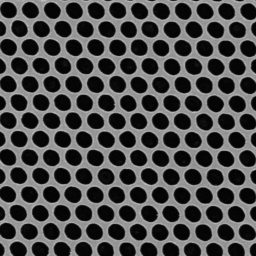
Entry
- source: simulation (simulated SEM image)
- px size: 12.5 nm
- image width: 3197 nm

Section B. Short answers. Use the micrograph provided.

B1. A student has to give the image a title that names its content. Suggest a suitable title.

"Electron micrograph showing a regular array of holes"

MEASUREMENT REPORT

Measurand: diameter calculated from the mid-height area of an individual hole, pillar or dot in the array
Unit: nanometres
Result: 210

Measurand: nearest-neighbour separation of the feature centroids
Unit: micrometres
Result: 0.264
